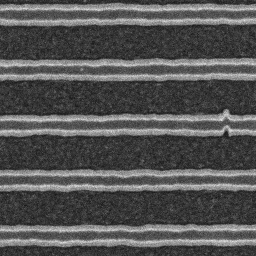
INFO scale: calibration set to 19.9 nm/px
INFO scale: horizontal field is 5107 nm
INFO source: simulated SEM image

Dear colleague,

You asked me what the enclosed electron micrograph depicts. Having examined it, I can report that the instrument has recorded parallel lines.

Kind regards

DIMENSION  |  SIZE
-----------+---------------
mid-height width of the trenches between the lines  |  0.798 um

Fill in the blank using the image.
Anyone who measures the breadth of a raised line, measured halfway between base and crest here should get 0.304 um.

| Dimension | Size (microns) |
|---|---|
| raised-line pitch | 1.1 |